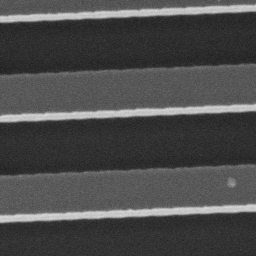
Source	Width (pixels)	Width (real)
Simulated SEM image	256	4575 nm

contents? lines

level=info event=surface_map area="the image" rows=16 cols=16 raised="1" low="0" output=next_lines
1111111111111111
0000000000000000
0000000000000000
0000000000000000
0000011111111111
1111111111111111
1111111111111111
1110000000000000
0000000000000000
0000000000000000
0000000000001111
1111111111111111
1111111111111111
1111111111000000
0000000000000000
0000000000000000